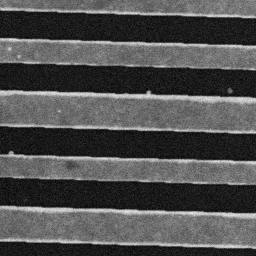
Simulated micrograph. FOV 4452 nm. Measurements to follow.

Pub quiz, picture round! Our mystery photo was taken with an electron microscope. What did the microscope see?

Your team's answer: lines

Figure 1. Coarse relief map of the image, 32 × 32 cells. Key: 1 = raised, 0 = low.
11111111111111111111111111111111
00000000000111111111111111111111
00000000000000000000000000000000
00000000000000000000000000000000
00000000000000000000000000000000
11111111111111111111110000000000
11111111111111111111111111111111
11111111111111111111111111111111
00000000000000000000000000011111
00000000000000000000000000000000
00000000000000000000000000000000
11100000000000000000000000000000
11111111111111111111111111111111
11111111111111111111111111111111
11111111111111111111111111111111
11111111111111111111111111111111
00000000000000000000000000000111
00000000000000000000000000000000
00000000000000000000000000000000
11100000000000000000000000000000
11111111111111111111111111111111
11111111111111111111111111111111
00000000000011111111111111111111
00000000000000000000000000000000
00000000000000000000000000000000
00000000000000000000000000000000
11111111111111111000000000000000
11111111111111111111111111111111
11111111111111111111111111111111
11111111111111111111111111111111
00000000000000001111111111111111
00000000000000000000000000000000